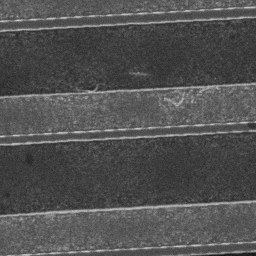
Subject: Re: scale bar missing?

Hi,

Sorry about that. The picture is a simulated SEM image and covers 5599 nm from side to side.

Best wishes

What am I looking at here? lines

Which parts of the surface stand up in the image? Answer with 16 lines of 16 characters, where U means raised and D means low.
UUUUUUUUUUUUUUUU
UUUUUUUUDDDDDDDD
DDDDDDDDDDDDDDDD
DDDDDDDDDDDDDDDD
DDDDDDDDDDDDDDDD
DDDDDDDDDDDDUUUU
UUUUUUUUUUUUUUUU
UUUUUUUUUUUUUUUU
UUUUUUUUUUDDDDDD
DDDDDDDDDDDDDDDD
DDDDDDDDDDDDDDDD
DDDDDDDDDDDDDDDD
DDDDDDDDDDDDDDDD
DUUUUUUUUUUUUUUU
UUUUUUUUUUUUUUUU
UUUUUUUUUUUUUUUU